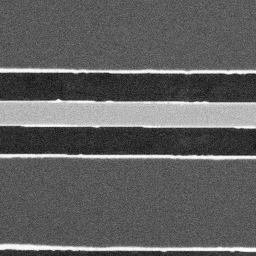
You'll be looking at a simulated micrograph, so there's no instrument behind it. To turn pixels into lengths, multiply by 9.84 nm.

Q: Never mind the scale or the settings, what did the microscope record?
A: lines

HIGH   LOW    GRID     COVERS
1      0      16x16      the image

1111111111111111
1111111111111111
1111111111111111
1111111111111111
0000000000000010
0000000000000000
1111111111111111
1111111111111111
0000000000000000
0000000000000000
1111111111111111
1111111111111111
1111111111111111
1111111111111111
1111111111111111
0001111111111111